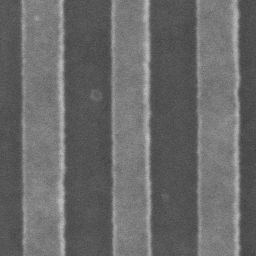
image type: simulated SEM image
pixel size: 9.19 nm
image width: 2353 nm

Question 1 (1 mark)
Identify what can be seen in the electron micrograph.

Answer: lines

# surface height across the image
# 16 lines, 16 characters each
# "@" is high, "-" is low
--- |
-@@@---@@---@@@-
-@@@---@@---@@@-
-@@@---@@---@@@-
-@@@---@@---@@@-
-@@@---@@---@@@-
-@@@---@@---@@@-
-@@@---@@---@@@-
-@@@---@@---@@@-
-@@@---@@---@@@-
-@@@---@@---@@@-
-@@@---@@---@@@-
-@@@---@@---@@@-
-@@@---@@---@@@-
--@@---@@---@@@-
-@@@---@@---@@@-
-@@@---@@---@@@-